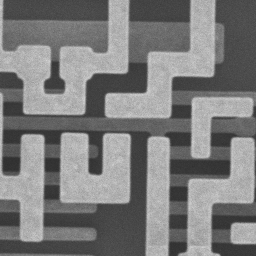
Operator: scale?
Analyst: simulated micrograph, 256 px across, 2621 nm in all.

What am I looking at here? wiring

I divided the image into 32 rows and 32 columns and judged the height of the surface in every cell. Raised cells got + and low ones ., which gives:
..............++........+++.....
..............++........+++.....
..............++........+++.....
..............++........+++.....
..............++........+++.....
..............++........+++.....
++++++..++++.+++.......++++.....
++++++..++++++++...++++++++.....
++++++..++++++++...++++++++.....
..++++..+++........+++...+......
...++...+++........++...........
...+++..+++.......+++...........
...++++++++..++++++++...+++++++.
...++++++++..++++++++...++++++++
.............++++++++...+++++++.
........................++......
........................++......
...++...+++..+++...++...++...+++
...++...+++..+++...++...++...+++
...++...+++..+++...++...++...+++
...++...+++..+++...++........+++
...++...+++..+++..+++........+++
+++++...++++++++..+++...++++++++
+++++...++++++++..+++...++++++++
+++++...++++++++..+++...++++++++
...++.............+++...+++.....
...++.............+++...++......
...++.............+++...++......
...++.............+++...++...+++
...++.............+++..+++...+++
..................+++..+++......
..................+++..++++.....